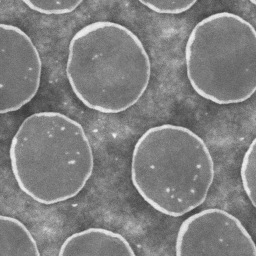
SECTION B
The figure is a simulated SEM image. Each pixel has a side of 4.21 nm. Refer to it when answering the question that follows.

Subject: raised bodies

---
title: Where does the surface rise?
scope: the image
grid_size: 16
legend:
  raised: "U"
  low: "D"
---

DDUUUDDDDUUUDDDD
DDDDDDUDDDDDUUUU
UUDDDUUUUDDDUUUU
UUDDUUUUUDDDUUUU
UUUDUUUUUDDDUUUU
UUDDDUUUUDDDUUUU
UUDDDUUUDDDDDDDD
DDUUDDDDDDDDDDDD
DUUUUDDDDUUUDDDD
DUUUUUDDUUUUUDDU
DUUUUUDDUUUUUDDU
DUUUUDDDUUUUUDDU
DDUUDDDDDUUUUDDD
DDDDDDDDDDDUUUDD
UUDDDUUDDDDUUUUD
UUDDUUUUDDDUUUUU